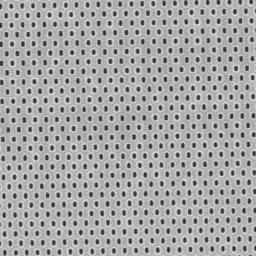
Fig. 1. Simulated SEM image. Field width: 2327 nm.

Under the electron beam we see a regular array of holes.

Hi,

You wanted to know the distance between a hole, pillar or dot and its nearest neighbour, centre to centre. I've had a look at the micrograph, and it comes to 94.3 nm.